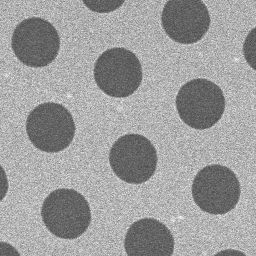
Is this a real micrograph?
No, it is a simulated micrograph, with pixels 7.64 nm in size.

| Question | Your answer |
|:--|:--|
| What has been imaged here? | holes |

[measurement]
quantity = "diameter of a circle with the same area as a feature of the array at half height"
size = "377 nm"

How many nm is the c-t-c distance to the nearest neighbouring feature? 661